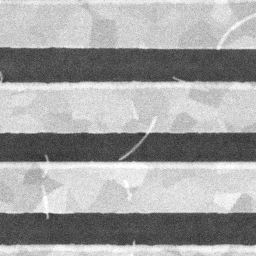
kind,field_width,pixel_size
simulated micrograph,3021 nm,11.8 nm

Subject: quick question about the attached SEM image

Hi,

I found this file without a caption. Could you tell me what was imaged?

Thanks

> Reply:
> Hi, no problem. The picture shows lines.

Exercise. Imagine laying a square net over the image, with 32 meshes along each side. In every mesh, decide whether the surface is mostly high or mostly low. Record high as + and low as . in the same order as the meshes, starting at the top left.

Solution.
++++++++++++++++++++++++++++++++
++++++++++++++++++++++++++++++++
++++++++++++++++++++++++++++++++
++++++++++++++++++++++++++++++++
++++++++++++++++++++++++++++++++
++++++++++++++++++++++++++++++++
................................
................................
................................
................................
+.........++++++++++++++++++++.+
++++++++++++++++++++++++++++++++
++++++++++++++++++++++++++++++++
++++++++++++++++++++++++++++++++
++++++++++++++++++++++++++++++++
++++++++++++++++++++++++++++++++
+++++..+++.+++..+.+..++.++......
................................
................................
................................
++++++++++++++++++++++++++++++++
++++++++++++++++++++++++++++++++
++++++++++++++++++++++++++++++++
++++++++++++++++++++++++++++++++
++++++++++++++++++++++++++++++++
++++++++++++++++++++++++++++++++
+++..++++.....+++++........++...
................................
................................
................................
................................
++++++++++++++++++++++++++++++++